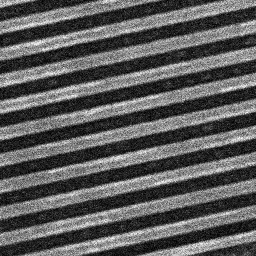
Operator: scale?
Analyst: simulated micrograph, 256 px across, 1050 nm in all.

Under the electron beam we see parallel lines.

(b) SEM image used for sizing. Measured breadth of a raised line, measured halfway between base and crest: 52.6 nm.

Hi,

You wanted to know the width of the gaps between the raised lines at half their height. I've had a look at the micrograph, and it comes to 53.1 nm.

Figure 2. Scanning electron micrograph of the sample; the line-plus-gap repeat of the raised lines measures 106 nanometres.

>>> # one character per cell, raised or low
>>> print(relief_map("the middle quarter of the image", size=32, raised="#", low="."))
#########................#######
####.................###########
................##############..
...........##############.......
.......##############...........
..###############...............
############................####
#######................#########
###................#############
..............###############...
.........###############........
.....##############.............
###############................#
##########................######
######................##########
.................##############.
............##############......
........#############...........
...##############...............
############.................###
#######.................########
###.................############
...............###############..
..........###############.......
......###############...........
.###############................
##########..................####
######................##########
##................##############
.............###############....
........###############.........
....###############.............